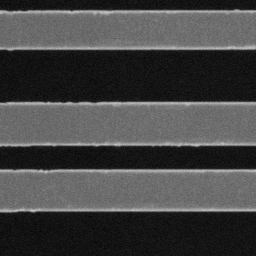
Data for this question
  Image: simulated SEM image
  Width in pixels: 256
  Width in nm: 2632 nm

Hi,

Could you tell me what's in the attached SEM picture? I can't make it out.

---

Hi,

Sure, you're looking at lines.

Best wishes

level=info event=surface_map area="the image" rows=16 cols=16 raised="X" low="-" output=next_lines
----------------
XXXXXXXXXXXXXXXX
XXXXXXXXXXXXXXXX
----------------
----------------
----------------
XXXXXXXXXXXXXXXX
XXXXXXXXXXXXXXXX
XXXXXXXXXXXXXXXX
----------------
----------------
XXXXXXXXXXXXXXXX
XXXXXXXXXXXXXXXX
----------------
----------------
----------------